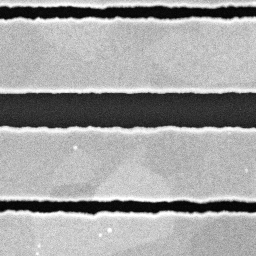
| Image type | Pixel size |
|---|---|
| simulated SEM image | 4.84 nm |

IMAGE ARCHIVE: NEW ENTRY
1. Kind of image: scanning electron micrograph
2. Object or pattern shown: lines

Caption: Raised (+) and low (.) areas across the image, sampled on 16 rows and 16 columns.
......+.........
++++++++++++++++
++++++++++++++++
++++++++++++++++
++++++++++++++++
++++++++++++++++
................
................
++++++++++++++++
++++++++++++++++
++++++++++++++++
++++++++++++++++
++++++++++++++++
++++++++++++++++
++++++++++++++++
++++++++++++++++